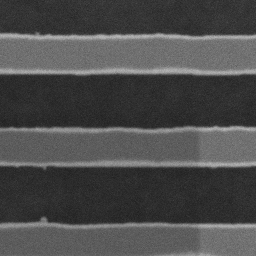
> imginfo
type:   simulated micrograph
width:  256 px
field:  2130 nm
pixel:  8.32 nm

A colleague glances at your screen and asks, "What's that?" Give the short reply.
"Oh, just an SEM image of lines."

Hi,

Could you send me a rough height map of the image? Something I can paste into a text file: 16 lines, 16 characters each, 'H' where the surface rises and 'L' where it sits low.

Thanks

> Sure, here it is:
LLLLLLLLLLLLLLLL
LLLLLLLLLLLLLLLL
HHHHHHHHHHHHHHHH
HHHHHHHHHHHHHHHH
HHHHHHHHHHHHHHHH
LLLLLLLLLLLLLLLL
LLLLLLLLLLLLLLLL
LLLLLLLLLLLLLLLL
HHHHHHHHHHHHHHHH
HHHHHHHHHHHHHHHH
LLLLLLLLLLLLLLLL
LLLLLLLLLLLLLLLL
LLLLLLLLLLLLLLLL
LLLLLLLLLLLLLLLL
HHHHHHHHHHHHHHHH
HHHHHHHHHHHHHHHH